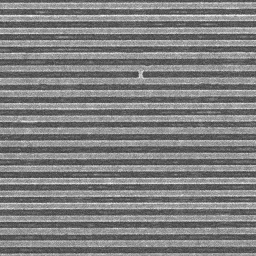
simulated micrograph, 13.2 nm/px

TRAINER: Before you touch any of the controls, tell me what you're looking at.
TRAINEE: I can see parallel lines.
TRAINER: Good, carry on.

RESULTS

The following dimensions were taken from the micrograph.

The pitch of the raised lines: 165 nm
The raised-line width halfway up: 0.0709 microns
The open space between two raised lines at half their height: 0.094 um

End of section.